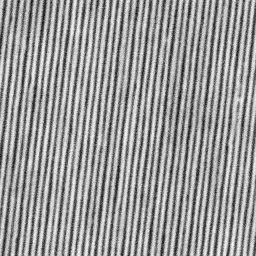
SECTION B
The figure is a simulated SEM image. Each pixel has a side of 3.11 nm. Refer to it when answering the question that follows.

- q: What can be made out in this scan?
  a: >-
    parallel lines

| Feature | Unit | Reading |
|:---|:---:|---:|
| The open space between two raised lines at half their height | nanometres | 10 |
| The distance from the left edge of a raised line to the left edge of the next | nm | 20.4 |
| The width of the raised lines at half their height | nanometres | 10.4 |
